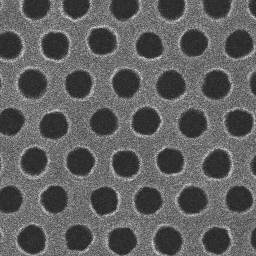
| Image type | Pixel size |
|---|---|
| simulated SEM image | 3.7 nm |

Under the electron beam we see a regular array of holes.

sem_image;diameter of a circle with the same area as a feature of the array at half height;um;0.0974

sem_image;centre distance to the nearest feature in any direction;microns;0.162